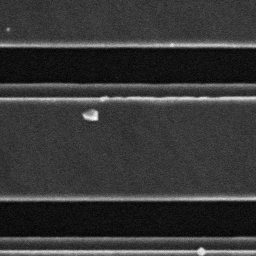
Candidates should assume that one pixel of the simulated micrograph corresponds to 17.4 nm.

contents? lines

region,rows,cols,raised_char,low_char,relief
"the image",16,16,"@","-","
@@@@@@@@@@@@@@@@
@@@@@@@@@@@@@@@@
@@@@@@@@@@@@@@@@
----------------
----------------
@@@@@@@@@@@@@@@@
@@@@@@@@@@@@@@@@
@@@@@@@@@@@@@@@@
@@@@@@@@@@@@@@@@
@@@@@@@@@@@@@@@@
@@@@@@@@@@@@@@@@
@@@@@@@@@@@@@@@@
----------------
----------------
----------------
@@@@@@@@@@@@@@@@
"